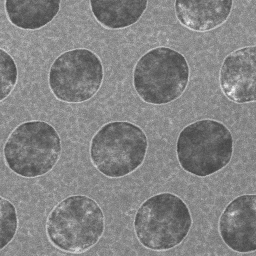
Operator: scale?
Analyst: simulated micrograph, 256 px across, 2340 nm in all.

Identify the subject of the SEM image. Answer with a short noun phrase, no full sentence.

holes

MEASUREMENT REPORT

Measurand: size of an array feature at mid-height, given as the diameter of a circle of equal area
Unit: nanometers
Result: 513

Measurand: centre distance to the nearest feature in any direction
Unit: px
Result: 84.6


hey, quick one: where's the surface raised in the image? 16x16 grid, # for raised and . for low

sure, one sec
....##...##...##
#..###..####..##
################
.###..###..###..
.##...##....##..
.##...##....##..
################
################
#...##...##...##
....##...##...##
#..###..####..##
################
####..###..####.
.##...###...##..
.##...###...##..
####..###..###..